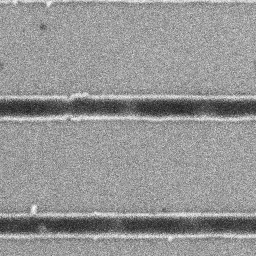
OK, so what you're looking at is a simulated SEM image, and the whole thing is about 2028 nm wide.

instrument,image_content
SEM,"one or a few lines or trenches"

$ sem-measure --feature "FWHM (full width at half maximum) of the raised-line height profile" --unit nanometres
184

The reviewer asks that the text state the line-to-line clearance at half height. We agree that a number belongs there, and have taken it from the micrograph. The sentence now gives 94.6 pixels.